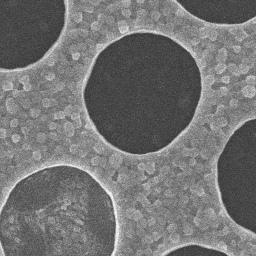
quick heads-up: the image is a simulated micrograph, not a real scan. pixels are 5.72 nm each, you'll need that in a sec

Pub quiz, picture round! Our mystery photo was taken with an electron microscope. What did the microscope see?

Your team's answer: holes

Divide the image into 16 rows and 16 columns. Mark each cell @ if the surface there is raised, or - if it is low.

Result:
----@@@@@@@-----
----@@@@@@@@@@-@
----@@@----@@@@@
---@@@------@@@@
@@@@@@------@@@@
@@@@@--------@@@
@@@@@-------@@@@
@@@@@@------@@@@
@@@@@@-----@@@--
@@@@@@@@--@@@@--
@@@@@@@@@@@@@@--
@@@---@@@@@@@@--
@-----@@@@@@@@--
-------@@@@@@@--
-------@@@@@@@@@
@@-----@@@@--@@@